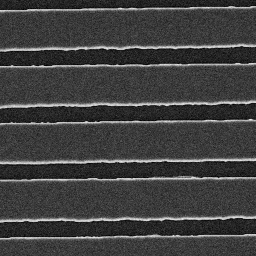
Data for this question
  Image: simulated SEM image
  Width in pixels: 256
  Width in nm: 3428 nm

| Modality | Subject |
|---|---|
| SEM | lines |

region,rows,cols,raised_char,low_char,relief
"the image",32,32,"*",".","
................................
********************************
********************************
********************************
********************************
********************************
................................
................................
********************************
********************************
********************************
********************************
********************************
................................
................................
********************************
********************************
********************************
********************************
********************************
................................
................................
....****************************
********************************
********************************
********************************
********************************
*******.****....................
................................
.....................**.********
********************************
********************************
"